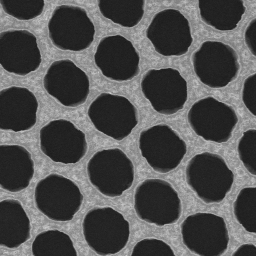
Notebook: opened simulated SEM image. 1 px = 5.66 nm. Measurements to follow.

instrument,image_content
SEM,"a regular array of holes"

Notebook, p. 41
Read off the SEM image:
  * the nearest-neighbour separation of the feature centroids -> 313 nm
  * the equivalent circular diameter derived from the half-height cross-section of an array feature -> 254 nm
